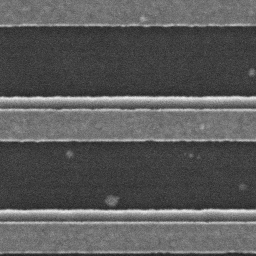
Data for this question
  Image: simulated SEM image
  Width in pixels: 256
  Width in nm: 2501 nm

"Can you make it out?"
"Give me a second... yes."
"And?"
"lines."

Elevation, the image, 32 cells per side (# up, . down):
################################
################################
################################
................................
................................
................................
................................
................................
................................
................................
................................
................................
################################
################################
################################
################################
################################
#############.####.#############
................................
................................
................................
................................
................................
................................
................................
................................
################################
################################
################################
################################
################################
####################.#######..##